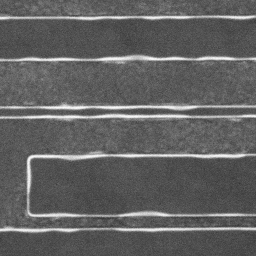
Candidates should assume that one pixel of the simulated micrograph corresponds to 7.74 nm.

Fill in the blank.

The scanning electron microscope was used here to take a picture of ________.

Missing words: groups of lines, slits or small figures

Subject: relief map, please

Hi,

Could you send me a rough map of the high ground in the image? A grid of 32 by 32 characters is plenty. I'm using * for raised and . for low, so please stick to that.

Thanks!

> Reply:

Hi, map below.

................................
................................
********************************
********************************
********************************
********************************
********************************
................................
................................
................................
................................
................................
................................
********************************
********************************
................................
................................
................................
................................
............*************.....**
....****************************
....****************************
....****************************
....****************************
....****************************
....****************************
....****************************
................................
................................
********************************
********************************
********************************